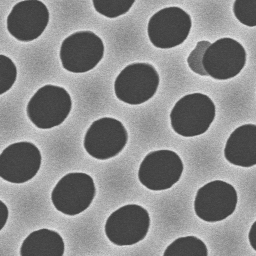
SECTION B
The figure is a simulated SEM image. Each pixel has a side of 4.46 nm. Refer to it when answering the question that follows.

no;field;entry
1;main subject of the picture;a regular array of holes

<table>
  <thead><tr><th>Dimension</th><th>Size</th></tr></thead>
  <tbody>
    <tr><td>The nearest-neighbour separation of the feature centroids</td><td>281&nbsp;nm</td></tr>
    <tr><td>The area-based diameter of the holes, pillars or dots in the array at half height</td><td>190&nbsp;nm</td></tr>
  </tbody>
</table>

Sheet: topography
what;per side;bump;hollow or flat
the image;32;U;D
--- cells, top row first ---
UUDDDUUUUUUUDDDDDUUUUUUUUUUUUDDD
UDDDDDUUUUUUDDDDUUUUDDDUUUUUUDDD
UDDDDDUUUUUUUUUUUUUDDDDDUUUUUUDD
UDDDDDUUUUUUUUUUUUDDDDDDUUUUUUUU
UUDDDUUUUDDDUUUUUUUDDDDUUUUUUUUU
UUUUUUUUDDDDDUUUUUUDDDUUUDDDDDUU
UUUUUUUDDDDDDUUUUUUUUUUUDDDDDDDU
DUUUUUUUDDDDUUUUUUUUUUUDDDDDDDDU
DDUUUUUUDDDDUUUUDDDUUUUUDDDDDDUU
DDUUUUUUUUUUUUUDDDDDUUUUUUDDDUUU
DDUUUUUUUUUUUUDDDDDDUUUUUUUUUUUU
DUUUUDDDUUUUUUDDDDDUUUUUUUUUUUUU
UUUUDDDDDUUUUUUDDDUUUUDDDDUUUUUU
UUUDDDDDDUUUUUUUUUUUUUDDDDDUUUUU
UUUUDDDDUUUUUUUUUUUUUDDDDDDUUUUU
UUUUDDDDUUUUDDDUUUUUUDDDDDUUUUUU
UUUUUUUUUUUDDDDDUUUUUUDDDDUUUDDD
UUUUUUUUUUUDDDDDUUUUUUUUUUUUDDDD
UDDDDUUUUUUDDDDUUUUUUUUUUUUUDDDD
DDDDDUUUUUUDDDUUUUDDDDUUUUUUDDDD
DDDDDUUUUUUUUUUUUUDDDDDUUUUUUDDD
DDDDDUUUUUUUUUUUUDDDDDDUUUUUUUUU
UDDDUUUUDDDDUUUUUDDDDDUUUUUUUUUU
UUUUUUUDDDDDUUUUUUDDDUUUUDDDDUUU
UUUUUUDDDDDDUUUUUUUUUUUUDDDDDDUU
UUUUUUUDDDDUUUUUUUUUUUUUDDDDDDUU
DUUUUUUUDDUUUUDDDDUUUUUUDDDDDUUU
DUUUUUUUUUUUUDDDDDDUUUUUUDDDUUUU
UUUUUUUUUUUUUDDDDDDUUUUUUUUUUUUD
UUUDDDDUUUUUUDDDDDUUUUUUUUUUUUUD
UUUDDDDDUUUUUUDDDUUUUDDDDDUUUUUD
UUUDDDDDUUUUUUUUUUUUUDDDDDUUUUUU